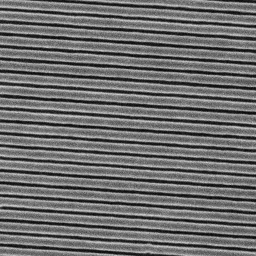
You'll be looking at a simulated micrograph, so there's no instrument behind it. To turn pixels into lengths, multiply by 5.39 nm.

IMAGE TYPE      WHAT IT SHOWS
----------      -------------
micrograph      parallel lines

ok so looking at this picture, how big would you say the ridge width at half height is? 0.0463 µm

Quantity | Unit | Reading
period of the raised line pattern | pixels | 12.4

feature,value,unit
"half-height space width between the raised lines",20.8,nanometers